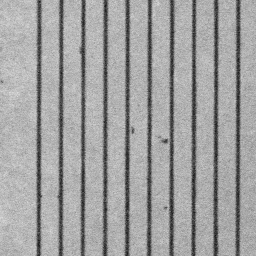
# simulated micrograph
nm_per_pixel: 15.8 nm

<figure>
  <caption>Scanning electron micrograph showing parallel lines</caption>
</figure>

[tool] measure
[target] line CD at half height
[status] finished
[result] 276 nm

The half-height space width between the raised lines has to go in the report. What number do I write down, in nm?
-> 72.9